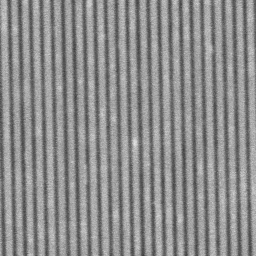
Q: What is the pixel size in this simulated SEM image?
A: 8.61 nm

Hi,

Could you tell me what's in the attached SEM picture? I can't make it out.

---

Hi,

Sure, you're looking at parallel lines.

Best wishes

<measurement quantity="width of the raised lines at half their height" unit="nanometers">48.4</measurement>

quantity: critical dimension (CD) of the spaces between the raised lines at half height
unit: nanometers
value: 40.9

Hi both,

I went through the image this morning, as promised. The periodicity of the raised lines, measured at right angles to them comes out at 0.0921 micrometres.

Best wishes